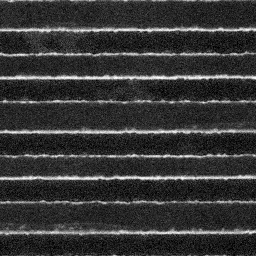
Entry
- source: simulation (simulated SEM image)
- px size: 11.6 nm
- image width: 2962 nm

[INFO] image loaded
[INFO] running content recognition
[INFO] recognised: lines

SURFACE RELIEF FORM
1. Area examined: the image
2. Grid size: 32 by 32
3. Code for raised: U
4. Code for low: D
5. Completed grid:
UUUUUUUUUUUUUUUUUUUUUUUUUUUUUUUU
UUUUUUUUUUUUUUUUUUUUUUUUUUUUUUUU
UUUUUUUUUUUUUUUUUUUUUUUUUUUUUUUU
UUUUUUUUUUUUUUUUUUUUUUUUUUUUUUUU
DDDDDDDDDDDDDDDDDDDDDDDDDDDDDDDD
DDDDDDDDDDDDDDDDDDDDDDDDDDDDDDDD
DDDDDDDDDDDDDDDDDDDDDDDDDDDDDDDD
UUUUUUUUUUUUUUUUUUUUUUUUUUUUUUUU
UUUUUUUUUUUUUUUUUUUUUUUUUUUUUUUU
UUUUUUUUUUUUUUUUUUUUUUUUUUUUUUUU
DDDDDDDDDDDDDDDDDDDDDDDDDDDDDDDD
DDDDDDDDDDDDDDDDDDDDDDDDDDDDDDDD
DDDDDDDDDDDDDDDDDDDDDDDDDDDDDDDD
UUUUUUUUUUUUUUUUUUUUUUUUUUUUUUUU
UUUUUUUUUUUUUUUUUUUUUUUUUUUUUUUU
UUUUUUUUUUUUUUUUUUUUUUUUUUUUUUUU
UUUUUDUUDDUDDUUDDDUDDDDDDDDDDDDD
DDDDDDDDDDDDDDDDDDDDDDDDDDDDDDDD
DDDDDDDDDDDDDDDDDDDDDDDDDDDDDDDD
DDDUDUDUDUDDDDDDUUDDDDDDDDUUUUUU
UUUUUUUUUUUUUUUUUUUUUUUUUUUUUUUU
UUUUUUUUUUUUUUUUUUUUUUUUUUUUUUUU
DDDDDDDDDDDDDDDDDDDDDDDDDDDDDDDD
DDDDDDDDDDDDDDDDDDDDDDDDDDDDDDDD
DDDDDDDDDDDDDDDDDDDDDDDDDDDDDDDD
UUUUUUUUUUUUUUUUUUUUUUUUUUUUUUUU
UUUUUUUUUUUUUUUUUUUUUUUUUUUUUUUU
UUUUUUUUUUUUUUUUUUUUUUUUUUUUUUUU
UUUUUUUUUUUUUUUUUUUUUUUUUUUUUUUU
DDDDDDDDDDDDDDDDDDDDDDDDDDDDDDDD
DDDDDDDDDDDDDDDDDDDDDDDDDDDDDDDD
DDDDDDDDDDDDDDDDDDDDDDDDDDDDDDDD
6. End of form